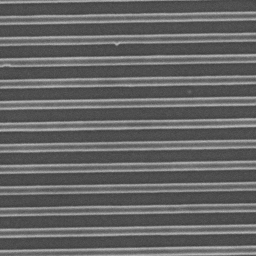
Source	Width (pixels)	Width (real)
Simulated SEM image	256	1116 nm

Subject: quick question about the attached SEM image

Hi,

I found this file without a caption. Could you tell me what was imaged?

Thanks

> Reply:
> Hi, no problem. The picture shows parallel lines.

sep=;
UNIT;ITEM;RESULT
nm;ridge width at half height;34.9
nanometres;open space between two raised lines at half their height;58.3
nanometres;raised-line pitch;92.9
